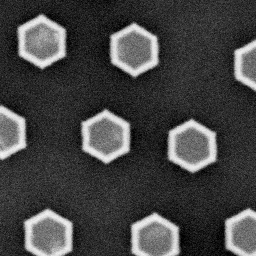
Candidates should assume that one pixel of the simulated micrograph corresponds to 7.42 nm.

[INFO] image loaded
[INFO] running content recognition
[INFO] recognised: raised bodies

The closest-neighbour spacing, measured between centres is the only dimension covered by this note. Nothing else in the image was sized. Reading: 0.656 µm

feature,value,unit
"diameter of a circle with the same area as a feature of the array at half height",0.331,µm